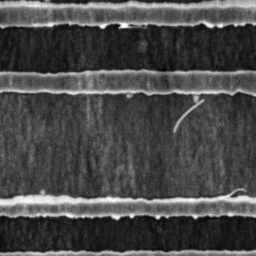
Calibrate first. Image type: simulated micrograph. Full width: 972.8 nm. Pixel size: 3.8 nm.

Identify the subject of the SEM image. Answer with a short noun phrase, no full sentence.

lines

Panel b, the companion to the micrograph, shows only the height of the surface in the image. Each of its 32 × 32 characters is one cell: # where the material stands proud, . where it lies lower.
..#.............#...........##.#
################################
################################
................................
................................
................................
................................
................................
................................
################################
################################
...##.###########.##############
................................
................................
................................
................................
................................
................................
................................
................................
................................
................................
................................
................................
................................
################################
################################
................................
................................
................................
................................
.......####..#..####.###########